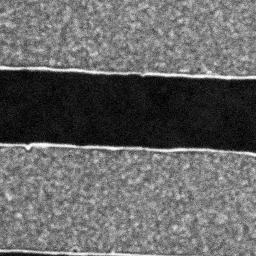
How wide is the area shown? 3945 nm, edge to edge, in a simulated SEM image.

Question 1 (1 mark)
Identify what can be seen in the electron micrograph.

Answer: one or a few lines or trenches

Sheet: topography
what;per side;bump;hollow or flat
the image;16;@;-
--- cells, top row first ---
----------------
----------------
----------------
----------------
@@@@@@----------
@@@@@@@@@@@@@@@@
@@@@@@@@@@@@@@@@
@@@@@@@@@@@@@@@@
@@@@@@@@@@@@@@@@
--------------@@
----------------
----------------
----------------
----------------
----------------
----------------